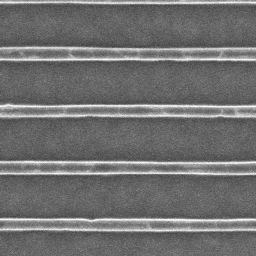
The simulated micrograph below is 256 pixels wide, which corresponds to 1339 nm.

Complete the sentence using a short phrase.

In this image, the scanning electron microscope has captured parallel lines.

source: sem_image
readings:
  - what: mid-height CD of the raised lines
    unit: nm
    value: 56.2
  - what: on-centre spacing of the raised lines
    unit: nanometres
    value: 298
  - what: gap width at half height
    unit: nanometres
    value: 240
